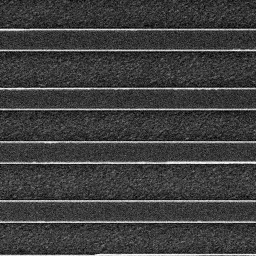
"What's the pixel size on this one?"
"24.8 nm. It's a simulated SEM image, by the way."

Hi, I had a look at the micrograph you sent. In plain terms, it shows lines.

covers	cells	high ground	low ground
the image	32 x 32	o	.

................................
................................
................................
................................
oooooooooooooooooooooooooooooooo
oooooooooooooooooooooooooooooooo
................................
................................
................................
................................
................................
oooooooooooooooooooooooooooooooo
oooooooooooooooooooooooooooooooo
oooooooooooooooooooooooooooooooo
................................
................................
................................
................................
oooooooooooooooooooooooooooooooo
oooooooooooooooooooooooooooooooo
................................
................................
................................
................................
................................
oooooooooooooooooooooooooooooooo
oooooooooooooooooooooooooooooooo
oooooooooooooooooooooooooooooooo
................................
................................
................................
................................